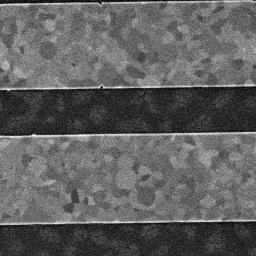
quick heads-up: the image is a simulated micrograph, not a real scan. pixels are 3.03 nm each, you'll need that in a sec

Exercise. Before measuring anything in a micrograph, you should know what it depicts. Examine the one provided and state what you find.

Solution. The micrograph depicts one or a few lines or trenches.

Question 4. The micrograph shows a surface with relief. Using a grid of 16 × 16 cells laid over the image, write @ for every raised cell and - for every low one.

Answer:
@@@@@@@@@@@@@@@@
@@@@@@@@@@@@@@@@
@@@@@@@@@@@@@@@@
@@@@@@@@@@@@@@@@
@@@@@@@@@@@@@@@@
@@@@@-----------
----------------
----------------
--@-@@@@@@@@@@@@
@@@@@@@@@@@@@@@@
@@@@@@@@@@@@@@@@
@@@@@@@@@@@@@@@@
@@@@@@@@@@@@@@@@
@@@@@@@@@@@@@@@@
----------------
----------------